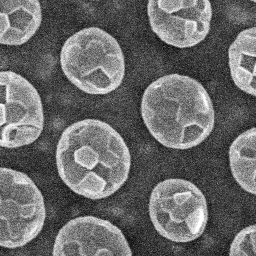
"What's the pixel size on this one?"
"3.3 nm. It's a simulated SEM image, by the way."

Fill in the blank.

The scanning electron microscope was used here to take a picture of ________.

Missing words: raised bodies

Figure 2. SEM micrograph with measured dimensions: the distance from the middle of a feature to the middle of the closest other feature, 322 nm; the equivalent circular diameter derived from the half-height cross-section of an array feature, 218 nm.